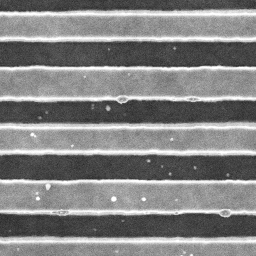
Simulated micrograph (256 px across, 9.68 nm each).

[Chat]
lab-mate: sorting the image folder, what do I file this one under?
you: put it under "lines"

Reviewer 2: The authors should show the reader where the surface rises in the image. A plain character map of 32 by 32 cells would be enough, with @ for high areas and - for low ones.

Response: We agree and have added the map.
--------------------------------
--------------------------------
@@@@@@@@@@@@@@@@@@@@@@@@@@@@@@@@
@@@@@@@@@@@@@@@@@@@@@@@@@@@@@@@@
@@@@@@@@@@@@@@@@@@@@@@@@@@@@@@@@
--------------------------------
--------------------------------
--------------------------------
---@@@@---@@-@---@-------@@@-@@@
@@@@@@@@@@@@@@@@@@@@@@@@@@@@@@@@
@@@@@@@@@@@@@@@@@@@@@@@@@@@@@@@@
@@@@@@@@@@@@@@@@@@@@@@@@@@@@@@@@
--------------@@-----@-@@-------
--------------------------------
--------------------------------
--------------------------------
@@@@@@@@@@@@@@@@@@@@@@@@@@@@@@@@
@@@@@@@@@@@@@@@@@@@@@@@@@@@@@@@@
@@@@@@@@@@@@@@@@@@@@@@@@@@@@@@@@
--------------------------------
--------------------------------
--------------------------------
--------------------------------
@@@@@@@@@@@@@@@@@@@@@@@@@@@@@@@@
@@@@@@@@@@@@@@@@@@@@@@@@@@@@@@@@
@@@@@@@@@@@@@@@@@@@@@@@@@@@@@@@@
--@@@@@@@@@@@--@@@@@@@@--@@@@@@@
--------------------------------
--------------------------------
--------------------------------
@@@@@@@@@@@@@@@@@@@@@@@@@@@@@@@@
@@@@@@@@@@@@@@@@@@@@@@@@@@@@@@@@